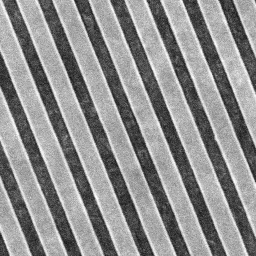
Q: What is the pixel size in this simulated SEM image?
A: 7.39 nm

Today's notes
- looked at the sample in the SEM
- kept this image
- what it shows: parallel lines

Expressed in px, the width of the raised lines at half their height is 19.2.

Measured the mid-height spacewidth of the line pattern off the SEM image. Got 101 nanometers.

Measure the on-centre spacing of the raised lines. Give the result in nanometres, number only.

248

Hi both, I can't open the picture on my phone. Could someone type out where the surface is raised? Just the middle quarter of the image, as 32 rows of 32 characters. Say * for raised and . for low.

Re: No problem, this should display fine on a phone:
....*****....*****....*****....*
....******...*****....*****....*
*....*****....*****....*****....
*....*****....*****....*****....
*....******...******...******...
**....*****....*****....*****...
**....*****....*****....*****...
***....*****...******....*****..
***....*****....*****....*****..
***....******...******...*****..
****....*****....*****....*****.
****....*****....*****....*****.
*****....*****...******....*****
*****....*****....*****....*****
******...******...******...*****
.*****....*****....*****....****
.*****....*****....*****....****
..*****....*****...******....***
..*****....*****....*****....***
..*****....******...******...***
...*****....*****....*****....**
...*****....*****....*****....**
....*****...******...******....*
....*****....*****....*****....*
*...******...******....*****...*
*....*****....*****....*****....
*....*****....*****....*****....
**....*****....*****....*****...
**....*****....*****....*****...
***...*****....******....*****..
***....*****....*****....*****..
***....*****....*****....*****..